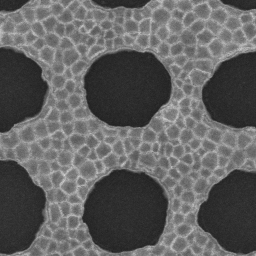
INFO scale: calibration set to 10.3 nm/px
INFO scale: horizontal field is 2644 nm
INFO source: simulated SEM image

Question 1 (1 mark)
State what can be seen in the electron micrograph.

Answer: holes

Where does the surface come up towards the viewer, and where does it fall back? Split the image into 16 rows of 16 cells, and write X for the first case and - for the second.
-XXXXXXX-XXXXXX-
XXXXXXXXXXXXXXXX
XXXXXXXXXXXXXXXX
--XXXX----XXXXX-
---XX-----XXX---
---XX------XX---
---XX-----XXX---
--XXXX---XXXX---
XXXXXXXXXXXXXXXX
XXXXXXXXXXXXXXXX
-XXXXXXXXXXXXXXX
--XXXX----XXXX--
---XX-----XXX---
---XX-----XX----
--XXXX----XXX---
--XXXX---XXXXX--